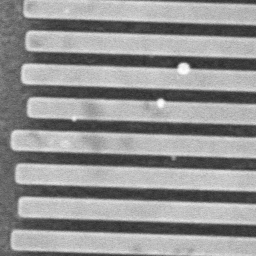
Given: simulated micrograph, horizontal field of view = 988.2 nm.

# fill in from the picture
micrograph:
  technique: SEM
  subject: groups of lines, slits or small figures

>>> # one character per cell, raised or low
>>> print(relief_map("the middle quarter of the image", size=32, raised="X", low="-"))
XXX--------------------------XX-
XXXXXXXXXXXXXXXXXXXXXXXXXXXXXXXX
XXXXXXXXXXXXXXXXXXXXXXXXXXXXXXXX
XXXXXXXXXXXXXXXXXXXXXXXXXXXXXXXX
XXXXXXXXXXXXXXXXXXXXXXXXXXXXXXXX
------XXXXXXXXXXXXXXXXXXXXXXXXXX
--------------------------------
--------------------------------
--------------------------------
XXXXXXXXXXXXXXXXXXXXXXXXX-------
XXXXXXXXXXXXXXXXXXXXXXXXXXXXXXXX
XXXXXXXXXXXXXXXXXXXXXXXXXXXXXXXX
XXXXXXXXXXXXXXXXXXXXXXXXXXXXXXXX
XXXXXXXXXXXXXXXXXXXXXXXXXXXXXXXX
---------------------------XXXXX
--------------------------------
--------------------------------
XXXXXXXXXXXX--------------------
XXXXXXXXXXXXXXXXXXXXXXXXXXXXXXXX
XXXXXXXXXXXXXXXXXXXXXXXXXXXXXXXX
XXXXXXXXXXXXXXXXXXXXXXXXXXXXXXXX
XXXXXXXXXXXXXXXXXXXXXXXXXXXXXXXX
---------------XXXXXXXXXXXXXXXXX
--------------------------------
--------------------------------
X-------------------------------
XXXXXXXXXXXXXXXXXXXXXXXXXXXXXXXX
XXXXXXXXXXXXXXXXXXXXXXXXXXXXXXXX
XXXXXXXXXXXXXXXXXXXXXXXXXXXXXXXX
XXXXXXXXXXXXXXXXXXXXXXXXXXXXXXXX
------------XXXXXXXXXXXXXXXXXXXX
--------------------------------